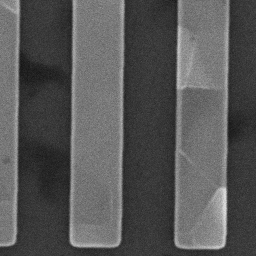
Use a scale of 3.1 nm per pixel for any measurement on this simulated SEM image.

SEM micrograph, wiring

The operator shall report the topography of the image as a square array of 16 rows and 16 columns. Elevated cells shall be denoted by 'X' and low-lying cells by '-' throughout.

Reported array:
X----XXX---XXX--
X----XXX---XXX--
X----XXX---XXX--
X----XXX---XXX--
X----XXX---XXX--
X----XXX---XXX--
X----XXX---XXX--
X----XXX---XXX--
X---XXXX---XXX--
X---XXXX---XXX--
X---XXXX---XXX--
X---XXXX---XXX--
X---XXXX---XXX--
X---XXXX---XXX--
X---XXXX---XXX--
-----------XXX--